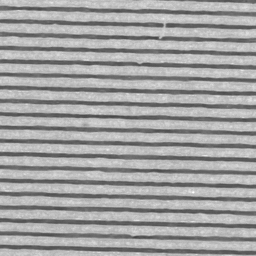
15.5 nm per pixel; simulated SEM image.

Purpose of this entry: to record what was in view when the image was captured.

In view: parallel lines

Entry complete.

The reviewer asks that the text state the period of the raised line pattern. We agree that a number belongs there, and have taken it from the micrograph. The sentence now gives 206 nm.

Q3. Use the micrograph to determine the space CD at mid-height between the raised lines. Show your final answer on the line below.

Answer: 66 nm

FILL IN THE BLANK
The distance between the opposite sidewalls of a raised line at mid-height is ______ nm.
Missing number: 132